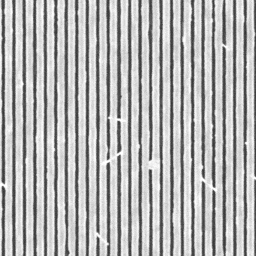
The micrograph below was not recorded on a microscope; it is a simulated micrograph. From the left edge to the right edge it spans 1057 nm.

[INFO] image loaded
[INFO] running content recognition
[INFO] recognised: parallel lines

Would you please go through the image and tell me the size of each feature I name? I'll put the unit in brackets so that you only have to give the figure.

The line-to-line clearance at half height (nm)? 17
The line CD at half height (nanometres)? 27.9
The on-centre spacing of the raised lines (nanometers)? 43.4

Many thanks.